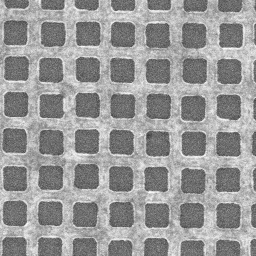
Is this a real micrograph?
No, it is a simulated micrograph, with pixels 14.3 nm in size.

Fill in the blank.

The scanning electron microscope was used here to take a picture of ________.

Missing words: a regular array of holes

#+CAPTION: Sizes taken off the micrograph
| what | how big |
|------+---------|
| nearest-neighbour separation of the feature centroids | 500 nm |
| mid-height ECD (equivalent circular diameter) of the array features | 0.402 µm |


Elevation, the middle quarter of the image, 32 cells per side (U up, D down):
UUUDDDDDDUUDDDDDDDUUDDDDDDDUUDDD
UUUDDDDDDUUDDDDDDDUUDDDDDDDUUDDD
UUUDDDDDDUUDDDDDDDUUDDDDDDDUUDDD
UUUDDDDDDUUUDDDDDDUUDDDDDDDUUDDD
UUUUDDDDUUUUDDDDDUUUUDDDDDUUUUDD
UUUUUUUUUUUUUUUUUUUUUUUUUUUUUUUU
UUUUUUUUUUUUUUUUUUUUUUUUUUUUUUUU
UUUDDDDDUUUUUDDDDUUUUDDDDDUUUUUU
UUUDDDDDDUUUDDDDDDUUDDDDDDDUUDDD
UUUDDDDDDUUUDDDDDDUUDDDDDDDUUDDD
UUUDDDDDDUUUDDDDDDUUDDDDDDDUUDDD
UUUDDDDDDUUDDDDDDDUUDDDDDDDUUDDD
UUUDDDDDDUUDDDDDDDUUDDDDDDDUUDDD
UUUUUDDDUUUUDDDDDUUUUDDDDDUUUDDD
UUUUUUUUUUUUUUUUUUUUUUUUUUUUUUDD
UUUUUUUUUUUUUUUUUUUUUUUUUUUUUUUU
UUUDDDDDUUUUDDDDUUUUUUUUUUUUUUUU
UUUDDDDDDUUDDDDDDDUUUDDDDDUUUDDD
UUUDDDDDDUUDDDDDDDUUDDDDDDDUUDDD
UUDDDDDDDUUDDDDDDDUUDDDDDDDUUDDD
UUDDDDDDDUUDDDDDDDUUDDDDDDDUUDDD
UUUDDDDDDUUDDDDDDDUUDDDDDDDUUDDD
UDUUDDDDUUUUDDDDDUUUDDDDDDDUUDDD
UUUDUUUUUUUUUUUUUUUUUUUUUUUUUUUU
UUUUUUUUUUUUUUUUUUUUUUUUUUUUUUUU
UUUDDDDDUUUUDDDDUUUUUDDDUUUUUUUU
UUDDDDDDDUUDDDDDDUUUDDDDDDUUUUDD
UUDDDDDDDUUDDDDDDDUUDDDDDDUUUDDD
UUDDDDDDDUUDDDDDDDUUDDDDDDUUUDDD
UUDDDDDDDUUDDDDDDDUUDDDDDDUUUDDD
UUUDDDDDDUUDDDDDDDUUDDDDDDUUUDDD
UUUUUDDDUUUUDDDDDUUUDDDDDDUUUDDD